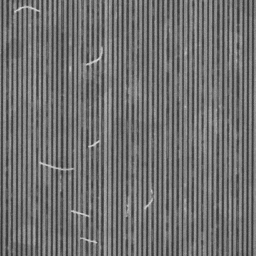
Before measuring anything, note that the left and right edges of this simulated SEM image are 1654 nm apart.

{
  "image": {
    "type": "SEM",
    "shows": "parallel lines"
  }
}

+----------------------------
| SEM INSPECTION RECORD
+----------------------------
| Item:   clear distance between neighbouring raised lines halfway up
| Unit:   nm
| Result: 16.2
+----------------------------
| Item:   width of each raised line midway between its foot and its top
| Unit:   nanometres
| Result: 15.4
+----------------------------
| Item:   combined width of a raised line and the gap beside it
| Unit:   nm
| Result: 32.4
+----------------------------